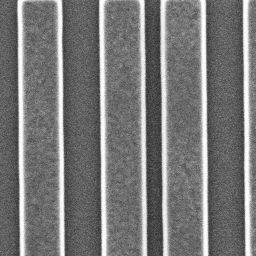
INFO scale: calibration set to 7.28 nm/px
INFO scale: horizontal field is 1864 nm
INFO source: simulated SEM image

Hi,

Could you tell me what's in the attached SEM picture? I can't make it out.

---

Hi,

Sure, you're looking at wiring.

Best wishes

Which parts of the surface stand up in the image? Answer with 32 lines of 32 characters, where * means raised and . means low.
...****......*****..*****......*
...****......*****..*****......*
...****......*****..*****......*
...****......*****..*****......*
...****......*****..*****......*
...****......*****..*****......*
...*****.....*****..*****......*
...*****.....*****..*****......*
...*****.....*****..*****......*
...*****.....*****..*****......*
...*****.....*****..*****......*
...*****.....*****..*****......*
...*****.....*****...*****.....*
...*****.....*****...*****.....*
...*****.....*****...*****.....*
...*****.....*****...*****.....*
...*****.....*****...*****.....*
...*****.....*****...*****.....*
...*****.....*****...*****.....*
...*****.....*****...*****.....*
...*****.....*****...*****.....*
...*****.....*****...*****.....*
...*****.....*****...*****.....*
...*****.....*****...*****.....*
...*****.....*****...*****.....*
...*****.....*****...*****.....*
...*****.....*****...*****.....*
...*****.....*****...*****.....*
...*****.....*****...*****.....*
...*****.....*****...*****.....*
...*****.....*****...*****.....*
...*****.....*****...*****.....*